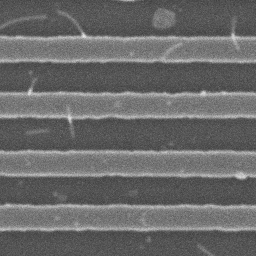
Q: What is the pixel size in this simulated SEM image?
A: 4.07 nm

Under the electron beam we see lines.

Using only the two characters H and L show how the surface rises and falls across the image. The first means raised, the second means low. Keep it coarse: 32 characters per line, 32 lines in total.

LLLLLLLLLLLLLLLLLLLLLLLLLLLLLLLL
LLLLLLLLLLLLLLLLLLLLLLLLLLLLLLLL
LLLLLLLLLLLLLLLLLLLLHLLLLLLLLLLL
LLLLLLLLLLLLLLLLLLLLLLLLLLLLLLLL
LLLLLLLLLLHLLLLLLLLLLLLLLLLLLLLL
HHHHHHHHHHHHHHHHHHHHHHHHHHHHHHHH
HHHHHHHHHHHHHHHHHHHHHHHHHHHHHHHH
HHHHHHHHHHHHHHHHHHHHHHHHHHHHHHHH
LLLLLLLLLLLLLLLLLLLLLLLLLLLLLLLL
LLLLLLLLLLLLLLLLLLLLLLLLLLLLLLLL
LLLLLLLLLLLLLLLLLLLLLLLLLLLLLLLL
LLLLLLLLLLLLLLLLLLLLLLLLLLLLLLLL
HHHHHHHHHHHHHHHHHHHHHHHHHHHHHHHH
HHHHHHHHHHHHHHHHHHHHHHHHHHHHHHHH
HHHHHHHHHHHHHHHHHHHHHHHHHHHHHHHH
LLLLLLLLLLLLLLLLLLLLLLLLLLLLLLLL
LLLLLLLLLLLLLLLLLLLLLLLLLLLLLLLL
LLLLLLLLLLLLLLLLLLLLLLLLLLLLLLLL
LLLLLLLLLLLLLLLLLLLLLLLLLLLLLLLL
HHHHHHHHHHHHHHHHHHHHHHHHHHHHHHHH
HHHHHHHHHHHHHHHHHHHHHHHHHHHHHHHH
HHHHHHHHHHHHHHHHHHHHHHHHHHHHHHHH
LLLLLLLLLLLLLLLLLLLLLLLLLLLLLLLL
LLLLLLLLLLLLLLLLLLLLLLLLLLLLLLLL
LLLLLLLLLLLLLLLLLLLLLLLLLLLLLLLL
LLLLLLLLLLLLLLLLLLLLLLLLLLLLLLLL
HHHHHHHHHHHHHHHHHHHHHHHHHHHHHHHH
HHHHHHHHHHHHHHHHHHHHHHHHHHHHHHHH
HHHHHHHHHHHHHHHHHHHHHHHHHHHHHHHH
LLLLLLLLLLLLLLLLLLLLLLLLLLLLLLLL
LLLLLLLLLLLLLLLLLLLLLLLLLLLLLLLL
LLLLLLLLLLLLLLLLLLLLLLLLLLLLLLLL